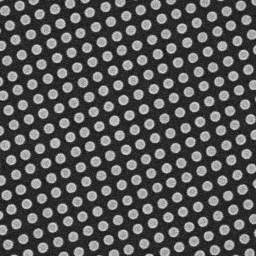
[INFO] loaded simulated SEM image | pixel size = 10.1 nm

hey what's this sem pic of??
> a regular array of raised bodies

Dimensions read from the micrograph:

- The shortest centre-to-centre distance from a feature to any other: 154 nm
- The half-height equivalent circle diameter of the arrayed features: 93.7 nanometers